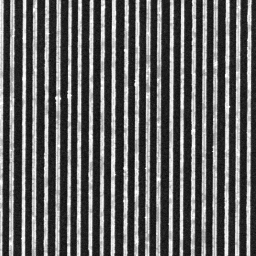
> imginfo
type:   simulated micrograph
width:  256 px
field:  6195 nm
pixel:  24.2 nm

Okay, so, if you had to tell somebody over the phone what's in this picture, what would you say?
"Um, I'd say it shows parallel lines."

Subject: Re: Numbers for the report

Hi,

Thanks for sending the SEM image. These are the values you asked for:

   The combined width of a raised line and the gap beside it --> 273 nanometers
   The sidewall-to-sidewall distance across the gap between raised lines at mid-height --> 0.197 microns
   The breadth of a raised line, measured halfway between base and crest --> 87.7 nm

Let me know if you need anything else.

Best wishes